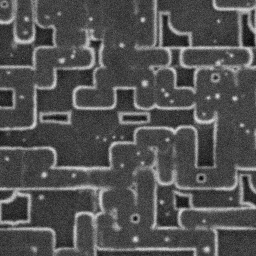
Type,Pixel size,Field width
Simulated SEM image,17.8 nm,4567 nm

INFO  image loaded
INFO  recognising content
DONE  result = wiring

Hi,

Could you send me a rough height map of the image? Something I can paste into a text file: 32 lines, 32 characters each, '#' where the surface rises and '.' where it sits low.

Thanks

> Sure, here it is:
###################........#####
###################.............
###################.............
..##..#############.............
..##...############.............
.......####..######.............
....########.########..########.
....########.########..########.
###########.#########...########
#######.....##########..########
#######.....##########..########
..###....######..###############
..##.....#####...###############
####......####...##.###.########
####....................########
####.......................#####
.................########..#####
.................########..#####
..............###########..#####
#######.......###########..#####
#######.......###########..#####
##############################..
##############################..
##########..#######...#######...
.............######.............
.............######.............
............#######....#########
.........##########...##########
.........###########..#####.####
#######..##################.....
#######..##################.....
############............###.....